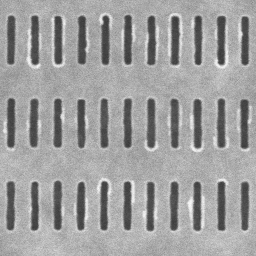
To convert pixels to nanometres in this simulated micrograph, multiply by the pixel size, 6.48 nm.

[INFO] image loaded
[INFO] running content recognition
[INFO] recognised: a regular array of holes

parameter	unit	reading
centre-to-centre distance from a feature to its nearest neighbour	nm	151